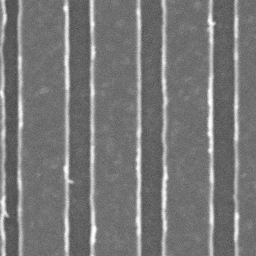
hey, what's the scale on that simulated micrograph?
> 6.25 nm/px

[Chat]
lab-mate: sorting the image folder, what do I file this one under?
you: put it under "one or a few lines or trenches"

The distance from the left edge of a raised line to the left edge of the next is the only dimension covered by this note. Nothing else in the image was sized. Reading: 0.451 microns